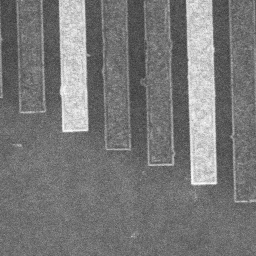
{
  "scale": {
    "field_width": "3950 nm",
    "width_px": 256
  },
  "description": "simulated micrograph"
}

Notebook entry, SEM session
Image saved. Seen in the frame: parallel lines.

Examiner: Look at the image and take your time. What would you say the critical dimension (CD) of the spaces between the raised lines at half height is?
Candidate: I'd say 280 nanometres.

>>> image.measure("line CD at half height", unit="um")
0.374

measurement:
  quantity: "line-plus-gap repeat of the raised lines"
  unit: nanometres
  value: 655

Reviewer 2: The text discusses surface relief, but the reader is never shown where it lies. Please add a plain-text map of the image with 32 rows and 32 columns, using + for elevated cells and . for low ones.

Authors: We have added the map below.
..+++...++...+++..+++..+++...+++
..+++...+++..+++..+++..+++...+++
..+++...+++..+++..+++..++++..+++
..+++...+++..+++..+++..++++..+++
..+++...+++..+++..+++..+++...+++
..+++...+++..+++..+++..++++..+++
..+++...+++..+++..+++...+++..+++
..+++...+++..+++..+++...+++..+++
..+++...+++..+++..+++...+++..+++
..+++...+++..+++..+++...+++..+++
..+++...+++..+++..+++...+++..+++
..+++...+++..+++..+++...+++..+++
..++++..+++..+++..+++...+++..+++
...+++..+++..+++..+++...+++..+++
........+++..+++...++...+++..+++
........+++..+++..+++...+++..+++
.............+++..++++..+++..+++
.............+++...+++..+++..+++
..............++...+++..+++..+++
...................+++..+++..+++
...................++...+++..+++
........................+++..+++
........................+++..+++
.............................+++
.............................+++
................................
................................
................................
................................
................................
................................
................................